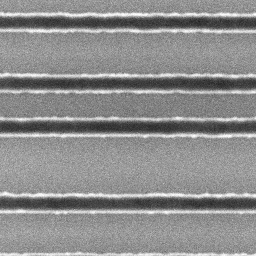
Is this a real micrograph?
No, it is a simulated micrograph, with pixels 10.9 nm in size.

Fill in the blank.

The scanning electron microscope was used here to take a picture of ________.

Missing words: lines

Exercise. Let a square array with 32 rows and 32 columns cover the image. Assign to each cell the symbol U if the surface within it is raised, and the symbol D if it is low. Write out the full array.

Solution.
DDDDDDDDDDDDDDDDDDDDDDDDDDDDDDDD
DDDDDDDDDDDDDDDDDDDDDDDDDDDDDDDD
UUUUUUUUUUUUUUUUUUUUUUUUUUUUUUUU
UUUUUUUUUUUUUUUUUUUUUUUUUUUUUUUU
DDDDDDDDDDDDDDDDDDDDDDDDDDDDDDDD
DDDDDDDDDDDDDDDDDDDDDDDDDDDDDDDD
DDDDDDDDDDDDDDDDDDDDDDDDDDDDDDDD
DDDDDDDDDDDDDDDDDDDDDDDDDDDDDDDD
DDDDDDDDDDDDDDDDDDDDDDDDDDDDDDDD
UUUUUUUUUUUUUUUUUUUUUUUUUUUUUUUU
UUUUUUUUUUUUUUUUUUUUUUUUUUUUUUUU
DUUUUUDUUUUUUUUDUUUUUUUUUUUUUUUU
DDDDDDDDDDDDDDDDDDDDDDDDDDDDDDDD
DDDDDDDDDDDDDDDDDDDDDDDDDDDDDDDD
DDDDDDDDDDDDDDDDDDDDDDDDDDDDDDDD
UUUUUUUUUUUUUUUUUUUUUUUUUUUUUUUU
UUUUUUUUUUUUUUUUUUUUUUUUUUUUUUUU
DDDDDDDDDDDDDDDDDDDDDDDDDDDDDDDD
DDDDDDDDDDDDDDDDDDDDDDDDDDDDDDDD
DDDDDDDDDDDDDDDDDDDDDDDDDDDDDDDD
DDDDDDDDDDDDDDDDDDDDDDDDDDDDDDDD
DDDDDDDDDDDDDDDDDDDDDDDDDDDDDDDD
DDDDDDDDDDDDDDDDDDDDDDDDDDDDDDDD
DDDDDDDDDDDDDDDDDDDDDDDDDDDDDDDD
UUUUUUUUUUUUUUUUUUUUUUUUUUUUUUUU
UUUUUUUUUUUUUUUUUUUUUUUUUUUUUUUU
UUUUUUUUUUUUUUUUUUUUUUUUUUUUUUUU
DDDDDDDDDDDDDDDDDDDDDDDDDDDDDDDD
DDDDDDDDDDDDDDDDDDDDDDDDDDDDDDDD
DDDDDDDDDDDDDDDDDDDDDDDDDDDDDDDD
DDDDDDDDDDDDDDDDDDDDDDDDDDDDDDDD
DDDDDDDDDDDDDDDDDDDDDDDDDDDDDDDD